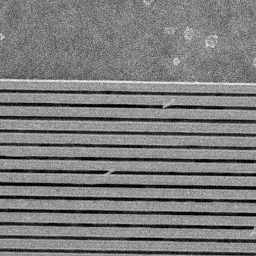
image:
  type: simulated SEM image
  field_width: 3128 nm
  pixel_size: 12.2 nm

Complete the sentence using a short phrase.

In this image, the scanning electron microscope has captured parallel lines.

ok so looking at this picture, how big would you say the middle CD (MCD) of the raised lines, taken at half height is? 116 nm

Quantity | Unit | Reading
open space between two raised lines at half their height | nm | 47.4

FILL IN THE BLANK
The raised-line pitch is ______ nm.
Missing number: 162